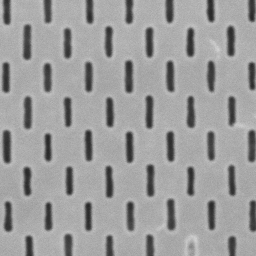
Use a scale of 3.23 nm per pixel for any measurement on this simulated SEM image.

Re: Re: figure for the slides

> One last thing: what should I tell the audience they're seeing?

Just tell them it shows a regular array of holes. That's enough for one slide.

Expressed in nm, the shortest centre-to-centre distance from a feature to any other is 128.